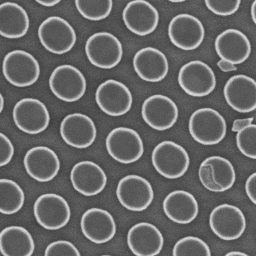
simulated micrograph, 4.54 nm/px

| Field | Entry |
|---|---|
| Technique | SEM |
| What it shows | a regular array of raised bodies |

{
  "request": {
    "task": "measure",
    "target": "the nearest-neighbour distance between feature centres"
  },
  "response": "219 nm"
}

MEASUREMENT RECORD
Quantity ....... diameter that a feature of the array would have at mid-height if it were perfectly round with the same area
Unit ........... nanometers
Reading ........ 153